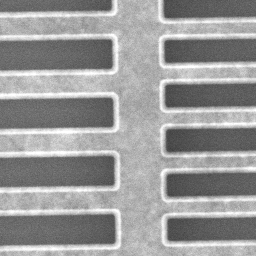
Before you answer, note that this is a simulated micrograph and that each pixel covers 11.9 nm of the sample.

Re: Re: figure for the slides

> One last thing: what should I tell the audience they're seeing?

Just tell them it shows groups of lines, slits or small figures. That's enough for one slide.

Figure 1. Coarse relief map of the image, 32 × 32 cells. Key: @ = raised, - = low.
--------------@@@@@@------------
--------------@@@@@@------------
@@@@@@@@@@@@@@@@@@@@@----------@
@@@@@@@@@@@@@@@@@@@@@@@@@@@@@@@@
@@@@@@@@@@@@@@@@@@@@@@@@@@@@@@@@
--------------@@@@@@------------
--------------@@@@@@------------
--------------@@@@@@------------
--------------@@@@@@@@@@@@@@@@@@
@@@@@@@@@@@@@@@@@@@@@@@@@@@@@@@@
@@@@@@@@@@@@@@@@@@@@@-----------
@@@@@@@@@@@@@@@@@@@@------------
--------------@@@@@@------------
--------------@@@@@@@-----------
---------------@@@@@@@@@@@@@@@@@
--------------@@@@@@@@@@@@@@@@@@
@@@@@@@@@@@@@@@@@@@@------------
@@@@@@@@@@@@@@@@@@@@------------
@@@@@@@@@@@@@@@@@@@@------------
--------------@@@@@@@@@@@@@@@@@@
---------------@@@@@@@@@@@@@@@@@
---------------@@@@@@-----------
---------------@@@@@@-----------
--------------@@@@@@@-----------
@@@@@@@@@@@@@@@@@@@@@-----------
@@@@@@@@@@@@@@@@@@@@@@@@@@@@@@@@
@@@@@@@@@@@---@@@@@@@@@@@@@@@@@@
---------------@@@@@@-----------
---------------@@@@@@-----------
---------------@@@@@@-----------
---------------@@@@@@@@@@@@@@@@@
@@@@@@@@@@@@@@@@@@@@@@@@@@@@@@@@